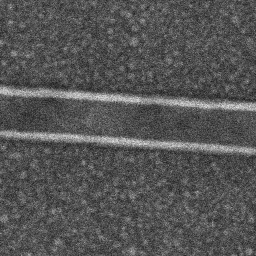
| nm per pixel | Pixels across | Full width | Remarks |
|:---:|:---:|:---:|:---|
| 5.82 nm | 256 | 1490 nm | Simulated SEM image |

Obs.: one or a few lines or trenches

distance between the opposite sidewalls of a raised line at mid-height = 250 nm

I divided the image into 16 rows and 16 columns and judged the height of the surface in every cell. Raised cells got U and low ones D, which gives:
DDDDDDDDDDDDDDDD
DDDDDDDDDDDDDDDD
DDDDDDDDDDDDDDDD
DDDDDDDDDDDDDDDD
DDDDDDDDDDDDDDDD
DDDDDDDDDDDDDDDD
UUUUUUUUUUUUDDDD
UUUUUUUUUUUUUUUU
DDUUUUUUUUUUUUUU
DDDDDDDDDDDDDDDD
DDDDDDDDDDDDDDDD
DDDDDDDDDDDDDDDD
DDDDDDDDDDDDDDDD
DDDDDDDDDDDDDDDD
DDDDDDDDDDDDDDDD
DDDDDDDDDDDDDDDD